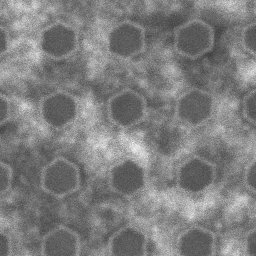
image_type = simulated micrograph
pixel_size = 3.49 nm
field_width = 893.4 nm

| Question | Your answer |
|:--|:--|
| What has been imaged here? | a regular array of raised bodies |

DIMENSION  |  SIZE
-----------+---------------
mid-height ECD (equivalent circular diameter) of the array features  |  132 nm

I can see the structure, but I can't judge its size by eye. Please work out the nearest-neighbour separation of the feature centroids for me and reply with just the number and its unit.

236 nm